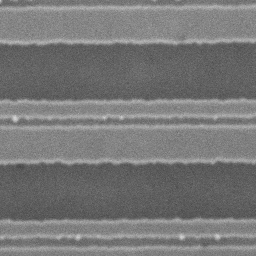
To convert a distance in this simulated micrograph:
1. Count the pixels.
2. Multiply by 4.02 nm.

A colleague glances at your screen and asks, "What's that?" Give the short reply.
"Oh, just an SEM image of lines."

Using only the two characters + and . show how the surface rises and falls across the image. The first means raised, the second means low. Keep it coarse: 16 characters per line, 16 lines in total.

++++++++++++++++
++++++++++++++++
++++++++++++++++
................
................
................
++++++++++++++++
++++++++++++++++
++++++++++++++++
++++++++++++++++
................
................
................
................
++++++++++++++++
++++++++++++++++